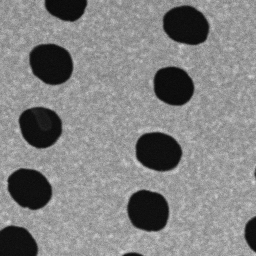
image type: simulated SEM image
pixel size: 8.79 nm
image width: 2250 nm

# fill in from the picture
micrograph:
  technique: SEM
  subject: holes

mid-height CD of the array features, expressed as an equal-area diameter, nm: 376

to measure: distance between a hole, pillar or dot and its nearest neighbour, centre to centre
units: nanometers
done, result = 544